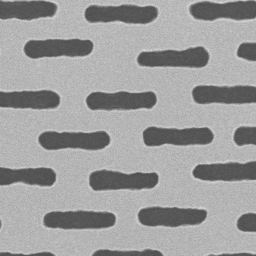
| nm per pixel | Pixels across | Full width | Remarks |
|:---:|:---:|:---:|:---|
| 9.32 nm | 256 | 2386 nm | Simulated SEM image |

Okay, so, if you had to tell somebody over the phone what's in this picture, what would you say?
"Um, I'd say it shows a regular array of holes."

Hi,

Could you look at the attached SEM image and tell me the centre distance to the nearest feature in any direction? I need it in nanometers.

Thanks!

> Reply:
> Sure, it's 571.